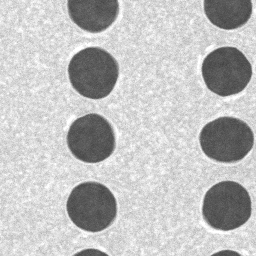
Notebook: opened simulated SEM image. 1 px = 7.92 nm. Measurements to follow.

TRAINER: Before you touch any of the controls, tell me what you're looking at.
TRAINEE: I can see holes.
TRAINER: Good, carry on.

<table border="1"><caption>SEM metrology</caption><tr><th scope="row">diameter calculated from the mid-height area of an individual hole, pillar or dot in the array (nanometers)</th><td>398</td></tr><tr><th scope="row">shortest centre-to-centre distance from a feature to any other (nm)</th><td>529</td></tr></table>